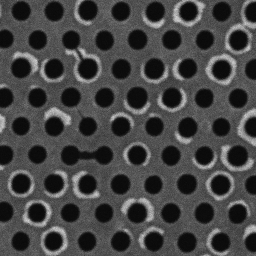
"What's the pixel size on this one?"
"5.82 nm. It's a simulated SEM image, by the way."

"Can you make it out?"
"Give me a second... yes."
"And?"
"a regular array of holes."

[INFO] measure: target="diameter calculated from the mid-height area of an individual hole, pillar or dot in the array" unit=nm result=115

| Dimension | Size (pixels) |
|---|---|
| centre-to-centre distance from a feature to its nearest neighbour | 32.8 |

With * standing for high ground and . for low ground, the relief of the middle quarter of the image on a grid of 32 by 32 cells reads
****....****.....***.....****...
***.....****.....***.....***....
****....****.....***.....****...
*****..******...*****...******..
********************************
********************************
....*****...****....*****...****
....****....****.....****....***
....****.....***.....***......**
....****....****.....****....***
...******..******...*****...****
********************************
********************************
*****..******..*******..******..
****....****....*****....****...
****....****.....***.....****...
****....****....****.....***....
****...*****....*****...*****...
******************************.*
********************************
...***************.*******.*****
....****....****....*****....***
............****.....***.....***
............****.....***.....***
...*****....*****...*****....***
**************************.*****
********************************
******************************..
****....****....*****...*****...
****....****.....***.....***....
****....***......***.....***....
****....****....****....*****...